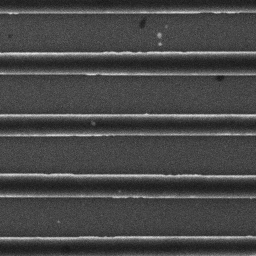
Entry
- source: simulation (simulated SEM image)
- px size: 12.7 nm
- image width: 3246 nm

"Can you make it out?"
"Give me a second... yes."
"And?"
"lines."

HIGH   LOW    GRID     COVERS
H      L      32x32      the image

HHHHHHHHHHHHHHHHHHHHHHHHHHHHHHHH
HHHHHHHHHHHHHHHHHHHHHHHHHLHHHHLL
LLLLLLLLLLLLLLLLLLLLLLLLLLLLLLLL
LLLLLLLLLLLLLLLLLLLLLLLLLLLLLLLL
LLLLLLLLLLLLLLLLLLLLLLLLLLLLLLLL
LLLLLLLLLLLLLLLLLLLLLLLLLLLLLLLL
LLLLLLLLLLLLLLLLLLLLLLLLLLLLLLLL
HHHHHHHHHHHHHHHHHHHHHHHHHHHHHHHH
HHHHHHHHHHHHHHHHHHHHHHHHHHHHHHHH
LLLLLLLLLLLLLLLLLLLLLLLLLLLLLLLL
LLLLLLLLLLLLLLLLLLLLLLLLLLLLLLLL
LLLLLLLLLLLLLLLLLLLLLLLLLLLLLLLL
LLLLLLLLLLLLLLLLLLLLLLLLLLLLLLLL
LLLLLLLLLLLLLLLLLLLLLLLLLLLLLLLL
HHHHHHHHHHHHHHHHHHHHHHHHHHHHHHHH
HHHHHHHHHHHHHHHHHHHHHHHHHHHHHHHH
HHHHHHHHHHHHHHHHHHHHHHHHHHHHHHHH
LLLLLLLLLLLLLLLLLLLLLLLLLLLLLLLL
LLLLLLLLLLLLLLLLLLLLLLLLLLLLLLLL
LLLLLLLLLLLLLLLLLLLLLLLLLLLLLLLL
LLLLLLLLLLLLLLLLLLLLLLLLLLLLLLLL
LLLLLLLLLLLLLLLLLLLLLLLLLLLLLLLL
HHHHHHHHHHHHHHHHHHHHHHHHHHHHHHHH
HHHHHHHHHHHHHHHHHHHHHHHHHHHHHHHH
HHHHHHHHHHHHHHHHHHHHHHHHHHHHHHHH
LLLLLLLLLLLLLLLLLLLLLLLLLLLLLLLL
LLLLLLLLLLLLLLLLLLLLLLLLLLLLLLLL
LLLLLLLLLLLLLLLLLLLLLLLLLLLLLLLL
LLLLLLLLLLLLLLLLLLLLLLLLLLLLLLLL
LLLLLLLLLLLLLLLLLLLLLLLLLLLLLLLL
HHHHHHHHHHHHHHHHHHHHHHHHHHHHHHHH
HHHHHHHHHHHHHHHHHHHHHHHHHHHHHHHH